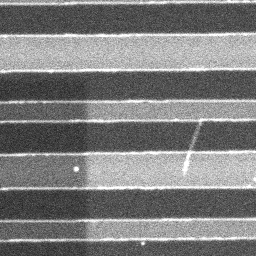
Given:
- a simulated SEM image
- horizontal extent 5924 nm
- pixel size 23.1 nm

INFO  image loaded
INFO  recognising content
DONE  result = lines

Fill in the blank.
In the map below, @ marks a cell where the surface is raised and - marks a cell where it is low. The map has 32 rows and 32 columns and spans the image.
------@-@@@@@@@@@@@@@@@@@@@@@@@@
@@@@@@@@@@@@@@@@@@@@@@@@@@@@@@@@
@@@@@@@@@@@@@@@@@@@@@@@@@@@@@@@@
@@@@@@@@@@@@@@@@@@@@@@@@@@@@@@@@
@-------------------------------
--------------------------------
--------------------------------
--------------------------------
--------------------------------
@@@@@@@@@@@@@@@@@@@@@@@@@@@@@@@@
@@@@@@@@@@@@@@@@@@@@@@@@@@@@@@@@
@@@@@@@@@@@@@@@@@@@@@@@@@@@@@@@@
@@@@@@@@@@@@@@@@@@@@@@@@@@@@@@@@
--------------------------------
--------------------------------
@@@@@@@@@@@@@@@@@@@@@@@@@@@@@@@@
@@@@@@@@@@@@@@@@@@@@@@@@@@@@@@@@
@@@@@@@@@@@@@@@@@@@@@@@@@@@@@@@@
@@@@@@@@@@@@@@@@@@@@@@@@@@@@@@@@
--------------------------------
--------------------------------
--------------------------------
--------------------------------
---------@--@@@@@@@@@@@@@@@@@@@@
@@@@@@@@@@@@@@@@@@@@@@@@@@@@@@@@
@@@@@@@@@@@@@@@@@@@@@@@@@@@@@@@@
@@@@@@@@@@@@@@@@@@@@@@@@@@@@@@@@
@@@@@@@@@@@@@@@@@@@@@@@@--------
--------------------------------
--------------------------------
@@@@@@@@@@@@@@@@@@@@@@@@@@@@@@@@
@@@@@@@@@@@@@@@@@@@@@@@@@@@@@@@@